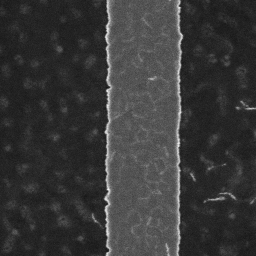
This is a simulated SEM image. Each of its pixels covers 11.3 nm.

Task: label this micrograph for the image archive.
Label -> one or a few lines or trenches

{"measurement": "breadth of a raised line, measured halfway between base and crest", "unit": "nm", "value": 812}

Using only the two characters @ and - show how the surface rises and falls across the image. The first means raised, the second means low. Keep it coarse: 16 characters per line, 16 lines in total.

-------@@@@-----
-------@@@@-----
-------@@@@-----
-------@@@@-----
-------@@@@-----
-------@@@@-----
-------@@@@-----
-------@@@@-----
-------@@@@-----
-------@@@@-----
-------@@@@-----
-------@@@@-----
-------@@@@-----
-------@@@@-----
-------@@@@-----
-------@@@@-----